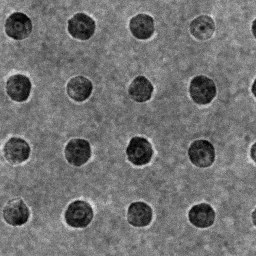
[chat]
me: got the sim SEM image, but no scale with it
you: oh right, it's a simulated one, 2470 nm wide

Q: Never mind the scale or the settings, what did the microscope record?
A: a regular array of ring-shaped grooves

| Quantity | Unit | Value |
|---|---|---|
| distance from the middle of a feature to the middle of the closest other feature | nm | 592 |